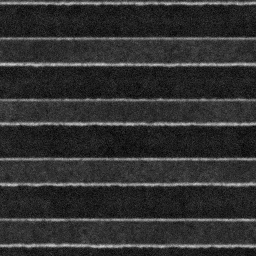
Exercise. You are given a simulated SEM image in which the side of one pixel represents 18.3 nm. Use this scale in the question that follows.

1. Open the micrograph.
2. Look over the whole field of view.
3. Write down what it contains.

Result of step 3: lines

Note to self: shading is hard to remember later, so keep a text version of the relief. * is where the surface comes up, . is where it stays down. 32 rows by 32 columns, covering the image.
.......*........................
................................
................................
................................
................................
********************************
********************************
********************************
................................
................................
................................
................................
.............................*..
********************************
********************************
********************************
................................
................................
................................
................................
********************************
********************************
********************************
................................
................................
................................
................................
********************************
********************************
********************************
********************************
................................